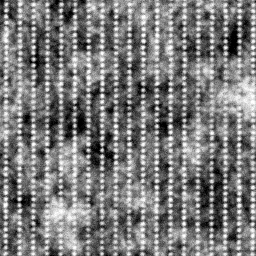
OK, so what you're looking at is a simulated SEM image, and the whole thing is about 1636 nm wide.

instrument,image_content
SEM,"a regular array of raised bodies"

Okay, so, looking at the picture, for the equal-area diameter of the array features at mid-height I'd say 23.9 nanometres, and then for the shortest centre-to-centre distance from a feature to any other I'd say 37.1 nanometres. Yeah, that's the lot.